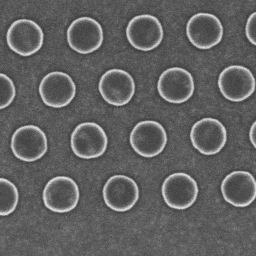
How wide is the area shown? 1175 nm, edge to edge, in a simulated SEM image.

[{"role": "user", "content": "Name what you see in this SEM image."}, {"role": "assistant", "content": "a regular array of raised bodies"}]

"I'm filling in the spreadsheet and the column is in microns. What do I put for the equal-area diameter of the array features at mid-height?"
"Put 0.159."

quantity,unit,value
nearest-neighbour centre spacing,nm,274